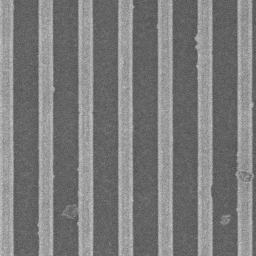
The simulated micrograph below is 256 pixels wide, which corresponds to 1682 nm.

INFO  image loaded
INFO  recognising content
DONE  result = parallel lines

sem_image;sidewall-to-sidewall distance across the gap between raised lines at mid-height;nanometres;182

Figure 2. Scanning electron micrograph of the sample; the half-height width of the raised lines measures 79.7 nm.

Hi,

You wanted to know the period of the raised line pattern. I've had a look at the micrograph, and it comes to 262 nm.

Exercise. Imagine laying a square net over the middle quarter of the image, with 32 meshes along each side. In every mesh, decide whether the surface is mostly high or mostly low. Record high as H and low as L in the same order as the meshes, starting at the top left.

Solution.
LLLLHHHLLLLLLLHHHLLLLLLLHHHLLLLL
LLLLHHHLLLLLLLHHHLLLLLLLHHHLLLLL
LLLLHHHLLLLLLLHHHLLLLLLLHHHLLLLL
LLLLHHHLLLLLLLHHHLLLLLLLHHHLLLLL
LLLLHHHLLLLLLLHHHLLLLLLLHHHLLLLL
LLLLHHHLLLLLLLHHHLLLLLLLHHLLLLLL
LLLLHHHLLLLLLLHHHLLLLLLLHHLLLLLL
LLLLHHHLLLLLLLHHHLLLLLLLHHHLLLLL
LLLLHHHLLLLLLLHHHLLLLLLLHHHLLLLL
LLLLHHHLLLLLLLHHHLLLLLLLHHHLLLLL
LLLLHHHLLLLLLLHHHLLLLLLLHHHLLLLL
LLLLHHHLLLLLLLHHHLLLLLLLHHHLLLLL
LLLLHHHLLLLLLLHHHLLLLLLLHHHLLLLL
LLLLHHHLLLLLLLHHHLLLLLLLHHHLLLLL
LLLLHHHLLLLLLLHHHLLLLLLLHHHLLLLL
LLLLHHHLLLLLLLHHHLLLLLLLHHHLLLLL
LLLLHHHLLLLLLLHHHLLLLLLLHHHLLLLL
LLLLHHHLLLLLLLHHHLLLLLLLHHHLLLLL
LLLLHHHLLLLLLLHHHLLLLLLLHHHLLLLL
LLLLHHHLLLLLLLHHHLLLLLLLHHHLLLLL
LLLLHHHLLLLLLLHHHLLLLLLLHHHLLLLL
LLLLHHHLLLLLLLHHHLLLLLLLHHHLLLLL
LLLLHHHLLLLLLLHHHLLLLLLLHHHLLLLL
LLLLHHHLLLLLLLHHHLLLLLLLHHHLLLLL
LLLLHHHLLLLLLLHHHLLLLLLLHHHLLLLL
LLLLHHHLLLLLLLHHHLLLLLLLHHHLLLLL
LLLLHHHLLLLLLLHHHLLLLLLLHHHLLLLL
LLLLHHHLLLLLLLHHHLLLLLLLHHHLLLLL
LLLLHHHLLLLLLLHHHLLLLLLLHHHLLLLL
LLLLHHHLLLLLLLHHHLLLLLLLHHHLLLLL
LLLLHHHLLLLLLLHHHLLLLLLLHHHLLLLL
LLLLHHHLLLLLLLHHHLLLLLLLHHHLLLLL